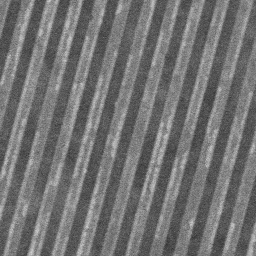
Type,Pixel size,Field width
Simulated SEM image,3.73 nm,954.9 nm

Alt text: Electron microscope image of parallel lines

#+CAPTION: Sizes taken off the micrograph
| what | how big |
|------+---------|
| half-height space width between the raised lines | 43.8 nm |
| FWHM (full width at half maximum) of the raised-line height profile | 43.3 nanometres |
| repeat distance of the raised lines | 87.8 nm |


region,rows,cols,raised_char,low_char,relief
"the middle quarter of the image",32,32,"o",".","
....oo....oo....ooo...ooo...ooo.
...ooo...ooo...ooo...ooo...ooo..
...ooo...ooo...ooo...ooo...ooo..
...oo....ooo...ooo...ooo...ooo..
...oo....oo....ooo...ooo...ooo..
..ooo...ooo...ooo...ooo...ooo...
..oo....ooo...ooo...ooo...ooo...
..oo....ooo...ooo...ooo...ooo...
.ooo...ooo....ooo...ooo...ooo...
.ooo...ooo...ooo...ooo....oo....
.ooo...ooo...ooo...ooo...ooo...o
.oo...ooo....ooo...ooo...ooo...o
ooo...ooo...ooo....oo....ooo...o
ooo...ooo...ooo...ooo....oo....o
ooo...ooo...ooo...ooo...ooo...oo
oo....ooo...ooo...ooo...ooo...oo
oo...ooo...ooo...ooo....oo....oo
oo...ooo...ooo...ooo...ooo....oo
oo...ooo...ooo...ooo...ooo...ooo
o....ooo...ooo...ooo...ooo...ooo
o...ooo...ooo...ooo....oo....oo.
o...ooo...ooo...ooo...ooo...ooo.
....ooo...ooo...ooo...ooo...ooo.
....oo....ooo...ooo...ooo...ooo.
...ooo...ooo...ooo....oo....oo..
...ooo...ooo...ooo...ooo...ooo..
...ooo...ooo...ooo...ooo...ooo..
..ooo....oo....ooo...ooo...ooo..
..ooo...ooo...ooo....oo....oo...
..ooo...ooo...ooo...ooo...ooo...
..oo....ooo...ooo...ooo...ooo...
.ooo...ooo...ooo....oo....ooo...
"